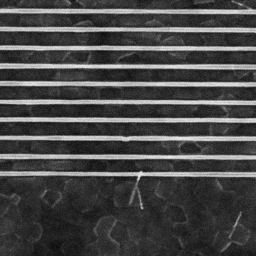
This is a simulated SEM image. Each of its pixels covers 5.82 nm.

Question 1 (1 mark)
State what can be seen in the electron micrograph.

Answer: parallel lines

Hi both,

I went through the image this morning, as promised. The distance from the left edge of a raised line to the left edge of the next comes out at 105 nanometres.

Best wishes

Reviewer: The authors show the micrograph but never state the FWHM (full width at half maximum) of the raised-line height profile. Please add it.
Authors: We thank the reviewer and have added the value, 15.3 nm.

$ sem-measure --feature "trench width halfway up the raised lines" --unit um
0.0888